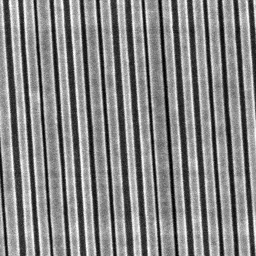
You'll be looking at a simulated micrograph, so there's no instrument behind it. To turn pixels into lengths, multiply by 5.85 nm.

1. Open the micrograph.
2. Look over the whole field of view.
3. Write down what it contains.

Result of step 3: parallel lines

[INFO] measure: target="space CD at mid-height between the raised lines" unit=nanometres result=35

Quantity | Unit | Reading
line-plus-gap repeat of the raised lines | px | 15.3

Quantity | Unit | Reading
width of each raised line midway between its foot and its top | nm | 50.3